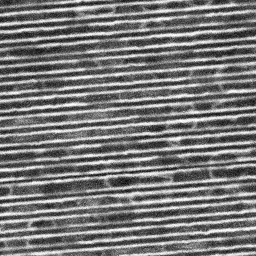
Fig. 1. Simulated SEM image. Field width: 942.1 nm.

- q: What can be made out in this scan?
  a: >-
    parallel lines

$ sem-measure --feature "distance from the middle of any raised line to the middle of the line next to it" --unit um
0.0634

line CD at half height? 44 nanometres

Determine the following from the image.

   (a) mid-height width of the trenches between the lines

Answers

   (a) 0.0193 microns